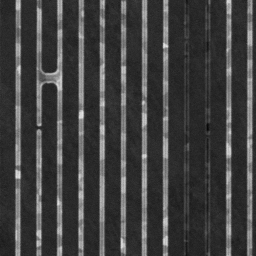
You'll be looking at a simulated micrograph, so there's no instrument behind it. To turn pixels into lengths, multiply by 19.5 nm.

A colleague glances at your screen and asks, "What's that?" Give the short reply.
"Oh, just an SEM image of parallel lines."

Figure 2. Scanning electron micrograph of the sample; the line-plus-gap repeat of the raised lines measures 411 nanometres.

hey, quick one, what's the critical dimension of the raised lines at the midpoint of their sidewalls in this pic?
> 0.0561 µm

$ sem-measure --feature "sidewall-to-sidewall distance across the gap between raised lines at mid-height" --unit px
17.9